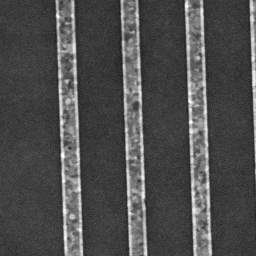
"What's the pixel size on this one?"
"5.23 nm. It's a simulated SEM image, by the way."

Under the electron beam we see one or a few lines or trenches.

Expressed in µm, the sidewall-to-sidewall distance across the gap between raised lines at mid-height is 0.255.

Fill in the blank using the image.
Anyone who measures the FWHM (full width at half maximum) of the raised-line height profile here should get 81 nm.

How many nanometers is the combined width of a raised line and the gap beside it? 337